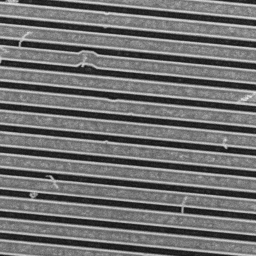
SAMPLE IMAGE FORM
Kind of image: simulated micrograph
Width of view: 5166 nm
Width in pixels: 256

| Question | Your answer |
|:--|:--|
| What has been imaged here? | parallel lines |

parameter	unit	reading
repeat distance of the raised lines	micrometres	0.434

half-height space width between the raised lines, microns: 0.171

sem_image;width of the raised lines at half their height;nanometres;249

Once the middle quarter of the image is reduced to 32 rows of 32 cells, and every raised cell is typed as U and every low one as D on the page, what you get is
DDDDDDDUUUUUUUUUUUUUUUUUUUUUUUUU
DDDDDDDDDDDDDDUUUUUUUUUUUUUUUUUU
DDDDDDDDDDDDDDDDDDDDDDDDUUUUUUUU
UUUUUUUUUUDDDDDDDDDDDDDDDDDDDDDD
UUUUUUUUUUUUUUUUUUUUUDDDDDDDDDDD
UUUUUUUUUUUUUUUUUUUUUUUUUUUUUUUD
DDDDDDDDDUUUUUUUUUUUUUUUUUUUUUUU
DDDDDDDDDDDDDDDDDDDDUDUUUUUUUUUU
UUUUUUDDDDDDDDDDDDDDDDDDDDDDDDDU
UUUUUUUUUUUUUUUUDDDDDDDDDDDDDDDD
UUUUUUUUUUUUUUUUUUUUUUUUUUUDDDDD
DDDDDDDUUUUUUUUUUUUUUUUUUUUUUUUU
DDDDDDDDDDDDDDDDDUUUUUUUUUUUUUUU
UDDDDDDDDDDDDDDDDDDDDDDDDDDDUUUU
UUUUUUUUUUUUDDDDDDDDDDDDDDDDDDDD
UUUUUUUUUUUUUUUUUUUUUUDDDDDDDDDD
DDDUUUUUUUUUUUUUUUUUUUUUUUUUUUUU
DDDDDDDDDDDDDUUUUUUUUUUUUUUUUUUU
DDDDDDDDDDDDDDDDDDDDDDDUUUUUUUUU
UUUUUUUDDDDDDDDDDDDDDDDDDDDDDDDD
UUUUUUUUUUUUUUUUUUDDDDDDDDDDDDDD
UUUUUUUUUUUUUUUUUUUUUUUUUUUUDUDD
DDDDDDDDUUUUUUUUUUUUUUUUUUUUUUUU
DDDDDDDDDDDDDDDDDDDUUUUUUUUUUUUU
UUUDUDDDDDDDDDDDDDDDDDDDDDDDDUUU
UUUUUUUUUUUUUUUDDDDDDDDDDDDDDDDD
UUUUUUUUUUUUUUUUUUUUUUUUUUDDDDDD
DDDDUUUUUUUUUUUUUUUUUUUUUUUUUUUU
DDDDDDDDDDDDDDUUUUUUUUUUUUUUUUUU
UDDDDDDDDDDDDDDDDDDDDDDDUUUUUUUU
UUUUUUUUUUUDDDDDDDDDDDDDDDDDDDDD
UUUUUUUUUUUUUUUUUUUUUDDDDDDDDDDD